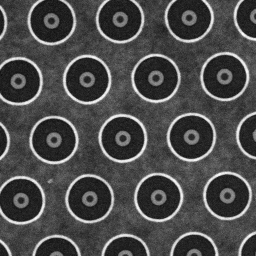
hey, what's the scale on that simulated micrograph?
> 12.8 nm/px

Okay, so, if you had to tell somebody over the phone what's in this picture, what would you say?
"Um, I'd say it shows an array of small figures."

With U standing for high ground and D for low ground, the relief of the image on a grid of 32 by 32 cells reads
UUUUUDDDUUUUUDDDDUUUUDDDDDUUUUDD
UUUUDDDDDUUUDDDDDDUUUDDDDDUUUUDD
DUUUDDUDDUUUDDUUDDUUUDDUDDDUUDDD
DUUUDDDDDUUUDDDDDDUUUDDDDDUUUUDD
UUUUDDDDDUUUUDDDDUUUUUDDDUUUUUUD
UUUUUUUUUUUUUUUUUUUUUUUUUUUUUUUU
UUUUUUUUUUUUUUUUUUUUUUUUUUUUUUUU
UDDUUUUUUUDDUUUUUUDDDUUUUUDDDDUU
DDDDDUUUUDDDDUUUUDDDDDUUUDDDDDDU
DDDDDUUUDDUDDDUUUDDUDDUUUDDUUDDU
DDUDDUUUDDUDDDUUUDDDDDUUUDDDDDDU
DDDDDUUUDDDDDUUUUDDDDDUUUUDDDDUU
UDDDUUUUUUDDUUUUUUUDUUUUUUUUUUUU
UUUUUUUUUUUUUUUUUUUUUUUUUUUUUUUU
UUUUUUUUUUUUUUUUUUUUUUUDDUUUUUUD
UUUUUDDDDUUUUDDDDUUUUUDDDDUUUUDD
DUUUDDDDDUUUUDDDDDUUUDDDDDDUUUDD
DUUUDDUDDDUUUDDUDDUUUDDUDDDUUUDD
DUUUDDDDDUUUUDDDDDUUUDDDDDUUUUDD
UUUUUDDDDUUUUUDDDUUUUUDDDUUUUUUD
UUUUUUUUUUUUUUUUUUUUUUUUUUUUUUUU
UUUUUUUUUUUUUUUUUUUUUUUUUUUUUUUU
UUDDUUUUUUDDDUUUUUDDDDUUUUDDDDUU
DDDDDUUUUDDDDDUUUDDDDDUUUUDDDDDU
DDUDDUUUDDDUDDUUUDDUUDDUUUDDUDDU
DDUDDUUUDDDDDDUUUDDDDDDUUUDDDDDU
DDDDDUUUUDDDDDUUUUDDDDUUUUUDDDUU
UDDDUUUUUUDDUUUUUUUDUUUUUUUUUUUU
UUUUUUUUUUUUUUUUUUUUUUUUUUUUUUUU
UUUUUUUUUUUUUUUDUUUUUUUDDUUUUUUD
UUUUUDDDDUUUUDDDDDUUUUDDDDDUUUDD
DUUUDDDDDDUUUDDDDDUUUUDDUDDUUUDD